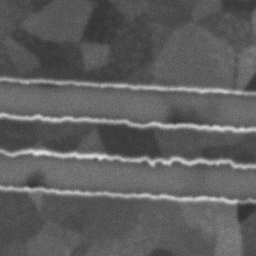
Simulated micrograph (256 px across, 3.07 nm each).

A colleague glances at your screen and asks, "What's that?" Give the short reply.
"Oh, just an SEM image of lines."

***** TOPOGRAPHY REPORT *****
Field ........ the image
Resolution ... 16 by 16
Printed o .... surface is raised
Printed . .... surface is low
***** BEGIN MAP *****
oooooooooooooooo
oooooooooooooooo
oooooooooooooooo
oooooooooooooooo
oooooooooooooooo
.........ooooooo
................
oooooo..........
oooooooooooooooo
oooooooooooooooo
................
................
oooooooooooooo..
oooooooooooooooo
oooooooooooooooo
oooooooooooooooo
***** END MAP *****